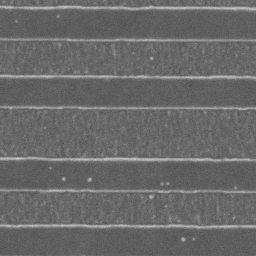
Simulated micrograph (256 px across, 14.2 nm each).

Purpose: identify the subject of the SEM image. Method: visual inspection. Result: lines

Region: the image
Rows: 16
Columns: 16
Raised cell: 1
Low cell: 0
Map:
1111111101111100
1111111111111111
0000111111111111
0000000000000000
0000000000000000
1111111111111111
1111111111111111
0000000000000000
0000000000000000
0000000000000000
1111111111111111
1111111111111111
0000000000000000
0000000000000000
1111111111111111
1111111111111111